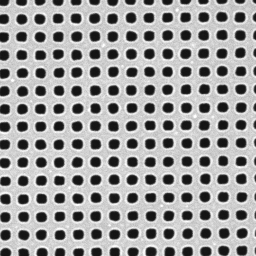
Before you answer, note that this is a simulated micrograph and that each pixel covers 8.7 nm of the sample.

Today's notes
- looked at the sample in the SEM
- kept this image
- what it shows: a regular array of holes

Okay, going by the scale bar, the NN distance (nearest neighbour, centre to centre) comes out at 154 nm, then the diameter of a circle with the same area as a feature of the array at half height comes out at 97.2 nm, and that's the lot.